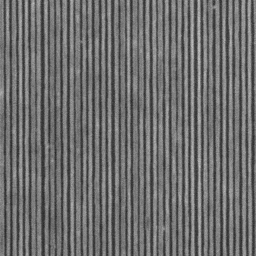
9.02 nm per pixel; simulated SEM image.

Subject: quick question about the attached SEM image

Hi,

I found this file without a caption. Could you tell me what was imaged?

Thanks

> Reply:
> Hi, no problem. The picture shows parallel lines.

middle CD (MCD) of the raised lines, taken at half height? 0.0271 um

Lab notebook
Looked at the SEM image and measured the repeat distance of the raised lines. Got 57.4 nm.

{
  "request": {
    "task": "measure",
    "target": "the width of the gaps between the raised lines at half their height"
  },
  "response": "0.0271 µm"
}